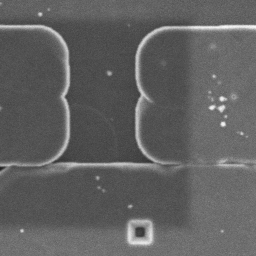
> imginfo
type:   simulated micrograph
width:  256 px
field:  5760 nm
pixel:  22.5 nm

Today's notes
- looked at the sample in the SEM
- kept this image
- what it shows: wiring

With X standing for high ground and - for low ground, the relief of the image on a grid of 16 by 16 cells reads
----------------
----------------
XXXX-----XXXXXXX
XXXX-----XXXXXXX
XXXX-----XXXXXXX
XXXX-----XXXXXXX
XXXX-----XXXXXXX
XXXX-----XXXXXXX
XXXX-----XXXXXXX
XXXX-----XXXXXXX
XXXXXXXXXXXXXXXX
XXXXXXXXXXXXXXXX
XXXXXXXXXXXXXXXX
XXXXXXXXXXXXXXXX
XXXXXXXX-XXXXXXX
XXXXXXXXXXXXXXXX